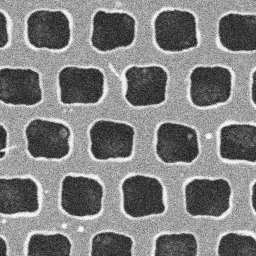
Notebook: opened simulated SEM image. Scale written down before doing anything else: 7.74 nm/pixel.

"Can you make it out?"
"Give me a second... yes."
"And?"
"a regular array of holes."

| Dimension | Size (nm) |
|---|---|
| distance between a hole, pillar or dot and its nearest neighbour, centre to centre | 485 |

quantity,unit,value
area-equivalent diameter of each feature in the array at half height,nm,345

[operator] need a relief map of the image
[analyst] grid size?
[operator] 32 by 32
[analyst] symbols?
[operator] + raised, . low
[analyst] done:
++++++++++++++++++++++++++++++++
++++....++++...+++++....++++++++
.++......+++.....++.....++++....
.++......+++.....++......++.....
.++......++......++......++.....
.+++.....+++....++++.....+++....
++++++++++++++++++++++++++++++.+
++++++++++++++++++++++++++++++++
++++++++....++++....+++++...++++
.....++......+++.....+++.....+++
.....++......+++.....+++.....+++
.....++......+++.....+++.....++.
.....+++....++++.....+++....++++
++++++++++++++++++++++++++++++++
++++++++++++++++++++++++++++++++
++++....++++....++++..+++++++.++
.++......++......+++....+++.....
.++......++......+++.....++.....
.++......++......++......++.....
++++....++++....++++.....+++....
++++++++++++++++++++++++++++++++
++++++++++++++++++++++++++++++++
....++++....++++....++++..+.++++
.....+++.....++.....+++......++.
.....+++.....++......++......++.
.....++......++......++......++.
.....+++.....+++....+++.....++++
++++++++++++++++++++++++++++++++
++++++++++++++++++++++++++++++++
++++....++++....++++....++++....
.++......++......++......++.....
.++......++.....+++......++.....